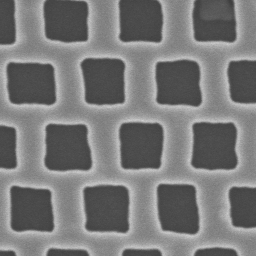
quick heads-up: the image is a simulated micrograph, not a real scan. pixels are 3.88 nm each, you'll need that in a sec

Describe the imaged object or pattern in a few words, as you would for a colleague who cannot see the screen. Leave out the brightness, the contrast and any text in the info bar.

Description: a regular array of holes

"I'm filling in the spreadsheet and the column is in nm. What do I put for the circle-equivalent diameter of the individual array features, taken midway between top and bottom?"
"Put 193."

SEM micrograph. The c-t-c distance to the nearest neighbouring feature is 72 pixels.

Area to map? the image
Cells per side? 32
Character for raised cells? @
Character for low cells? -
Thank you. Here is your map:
--@@@------@@@@-----@@@@-----@@@
--@@@------@@@@-----@@@@-----@@@
--@@@@-----@@@@-----@@@@-----@@@
--@@@@-----@@@@-----@@@@------@@
--@@@@-----@@@@-----@@@@------@@
--@@@@@@@@@@@@@@@@@@@@@@@@@@@@@@
@@@@@@@@@@@@@@@@@@@@@@@@@@@@@@@@
@@@@@@@@@@-----@@@@@@@@-@@@@@@-@
@------@@@------@@@------@@@----
@------@@@------@@@------@@@----
@------@@@@-----@@@------@@@@---
@------@@@@-----@@@@-----@@@@---
@------@@@@-----@@@@-----@@@@---
@@@@@@@@@@@@@@@@@@@@@@@@@@@@@@@@
@@@@@@@@@@@@@@@@@@@@@@@@@@@@@@@@
@@@@@@@@--@@@@@-----@@@@-----@@@
--@@@@-----@@@@-----@@@@------@@
--@@@@-----@@@@-----@@@@------@@
--@@@@-----@@@@-----@@@@-----@@@
--@@@@-----@@@@-----@@@@------@@
--@@@@-----@@@@-----@@@@------@@
@@@@@@@@@@@@@@@@@@@@@@@@@@@@@@@@
@@@@@@@@@@@@@@@@@@@@@@@@@@@@@@@@
@---@@@@@@@-----@@@@----@@@@@---
@-----@@@@------@@@@----@@@@@---
@-----@@@@------@@@@-----@@@@---
@------@@@@-----@@@@-----@@@@---
@------@@@@-----@@@@-----@@@@---
@------@@@@-----@@@@-----@@@@@@@
@@@@@@@@@@@@@@@@@@@@@@@@@@@@@@@@
@@@@@@@@@@@@@@@@@@@@@@@@@@@@@@@@
--@@@@-----@@@@-----@@@@------@@